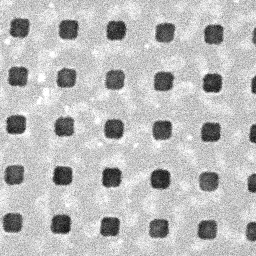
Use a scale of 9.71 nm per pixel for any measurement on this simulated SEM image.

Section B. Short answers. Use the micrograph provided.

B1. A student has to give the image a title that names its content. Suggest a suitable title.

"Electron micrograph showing a regular array of holes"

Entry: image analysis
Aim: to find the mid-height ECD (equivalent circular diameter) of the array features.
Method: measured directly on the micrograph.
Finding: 216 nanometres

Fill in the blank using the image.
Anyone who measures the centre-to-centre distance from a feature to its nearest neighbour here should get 469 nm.